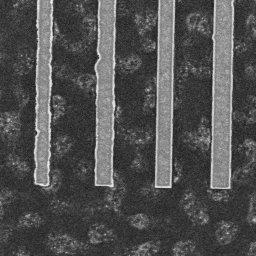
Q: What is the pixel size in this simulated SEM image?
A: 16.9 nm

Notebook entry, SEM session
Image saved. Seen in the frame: one or a few lines or trenches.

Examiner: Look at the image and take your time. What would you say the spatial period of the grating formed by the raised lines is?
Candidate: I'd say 1010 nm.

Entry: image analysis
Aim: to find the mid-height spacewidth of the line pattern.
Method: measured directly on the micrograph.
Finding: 0.736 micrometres